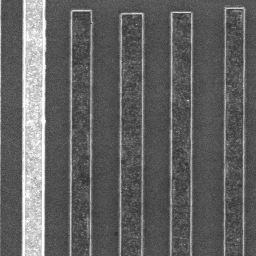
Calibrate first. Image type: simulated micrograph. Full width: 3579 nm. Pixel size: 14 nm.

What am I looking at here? parallel lines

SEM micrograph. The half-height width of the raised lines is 269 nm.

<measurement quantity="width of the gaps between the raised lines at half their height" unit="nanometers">416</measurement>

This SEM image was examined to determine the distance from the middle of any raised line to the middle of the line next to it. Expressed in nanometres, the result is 701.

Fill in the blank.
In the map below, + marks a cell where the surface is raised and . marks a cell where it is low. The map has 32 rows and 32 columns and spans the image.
...++...........................
...++....++.................++..
...++....++....+++....++....++..
...++....++....+++....++....++..
...++....++....+++....++....++..
...++....++....+++....++....++..
...++....++....+++....++....++..
...++....++....+++....++....++..
...++....++....+++....++....++..
...++....++....+++....++....++..
...++....++....+++....++....++..
...++....++....+++....++....++..
...++....++....+++....++....++..
...++....++....+++....++....++..
...++....++....+++....++....++..
...++....++....+++....++....++..
...++....++....+++....++....++..
...++....++....+++....++....++..
...++....++....+++....++....++..
...++....++....+++....++....++..
...++....++....+++....++....++..
...++....++....+++....++....++..
...++....++....+++...+++....++..
...++....++....+++...+++....++..
...++....++....+++...+++....++..
...++....++....+++...+++....++..
...++....++....+++...+++....++..
...++....++....+++...+++....++..
...++....++....+++...+++....++..
...++....++....+++...+++....++..
...++....++....+++...+++....++..
...++....++....+++...+++....++..